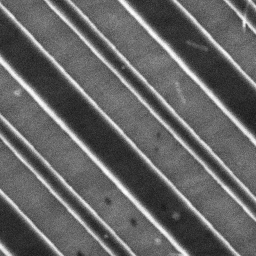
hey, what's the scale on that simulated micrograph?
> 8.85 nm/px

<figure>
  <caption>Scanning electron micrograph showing lines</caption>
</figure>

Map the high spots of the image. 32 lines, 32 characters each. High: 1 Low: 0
00000011100000011111110000001111
10000001110000001111111100000011
11000000111000000111111100000011
11100000011100000011111110000001
11110000001110000001111111000000
11111000000111000000111111100000
11111100000011100000011111110000
11111110000001110000001111111000
01111111000000111000000111111100
00111111100000011100000011111110
00011111100000001110000001111111
00001111110000000111000000111111
00000111111000000011000000011111
00000011111100000011100000001111
00000001111110000001110000000111
10000000111111000000111000000011
11000000011111100000011100000001
11100000011111110000001110000000
01110000001111111000000111000000
00111000000111111100000011100000
00011100000011111110000001110000
00001110000001111111000000111000
00000111000000111111100000011100
00000011100000011111110000001110
10000001110000001111111000000111
11000000111000000111111100000011
11100000011100000011111110000001
11110000001110000001111111000000
11111000000111000000111111100000
11111100000011100000011111110000
11111100000001110000001111110000
01111110000001110000000111111000